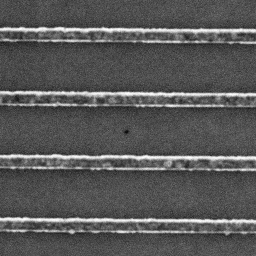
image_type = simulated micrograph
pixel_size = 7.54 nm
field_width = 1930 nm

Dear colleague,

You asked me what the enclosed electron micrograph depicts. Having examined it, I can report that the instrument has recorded lines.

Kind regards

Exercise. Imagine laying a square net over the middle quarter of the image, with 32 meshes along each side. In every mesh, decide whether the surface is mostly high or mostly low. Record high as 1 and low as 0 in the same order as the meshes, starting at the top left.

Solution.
00000000000000000000000000000000
00000000000000000000000000000000
00000000000000000000000000000000
00000000000000000000000000000000
00000000000000000000000000000000
00000000000000000000000000000000
00000000000000000000000000000000
11111111111111111111111111111111
11111111111111111111111111111111
11111111111111111111111111111111
00000000000000000000000000000000
00000000000000000000000000000000
00000000000000000000000000000000
00000000000000000000000000000000
00000000000000000000000000000000
00000000000000000000000000000000
00000000000000000000000000000000
00000000000000000000000000000000
00000000000000000000000000000000
00000000000000000000000000000000
00000000000000000000000000000000
00000000000000000000000000000000
00000000000000000000000000000000
11111111111111111111111111111111
11111111111111111111111111111111
11111111111111111111111111111111
00000000000000000000000000000000
00000000000000000000000000000000
00000000000000000000000000000000
00000000000000000000000000000000
00000000000000000000000000000000
00000000000000000000000000000000